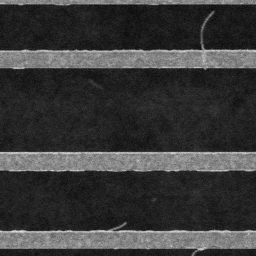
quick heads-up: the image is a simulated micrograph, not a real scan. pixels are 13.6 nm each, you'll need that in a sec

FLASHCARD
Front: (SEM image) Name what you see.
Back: lines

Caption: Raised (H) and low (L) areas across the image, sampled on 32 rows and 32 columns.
LLHLLLLHHLLLLLLLLLLHLLLLLLLLLLLL
LLLLLLLLLLLLLLLLLLLLLLLLLLLLLLLL
LLLLLLLLLLLLLLLLLLLLLLLLLLLLLLLL
LLLLLLLLLLLLLLLLLLLLLLLLLLLLLLLL
LLLLLLLLLLLLLLLLLLLLLLLLLLLLLLLL
LLLLLLLLLLLLLLLLLLLLLLLLLLLLLLLL
HHHHHHHHHHHHHHHHHHHHHHHHHHHHHHHH
HHHHHHHHHHHHHHHHHHHHHHHHHHHHHHHH
LHHLLLLLLLLLLLLLLLLLLLLLLHLLLLLL
LLLLLLLLLLLLLLLLLLLLLLLLLLLLLLLL
LLLLLLLLLLLLLLLLLLLLLLLLLLLLLLLL
LLLLLLLLLLLLLLLLLLLLLLLLLLLLLLLL
LLLLLLLLLLLLLLLLLLLLLLLLLLLLLLLL
LLLLLLLLLLLLLLLLLLLLLLLLLLLLLLLL
LLLLLLLLLLLLLLLLLLLLLLLLLLLLLLLL
LLLLLLLLLLLLLLLLLLLLLLLLLLLLLLLL
LLLLLLLLLLLLLLLLLLLLLLLLLLLLLLLL
LLLLLLLLLLLLLLLLLLLLLLLLLLLLLLLL
LLLLLLLLLLLLLLLLLLLLLLLLLLLLLLLL
HHHHHHHHHHHHHHHHHHHHHHHHHHHHHHHH
HHHHHHHHHHHHHHHHHHHHHHHHHHHHHHHH
LLLLLLLLLLLLLLLLLLLLLLLLLLLLLLLL
LLLLLLLLLLLLLLLLLLLLLLLLLLLLLLLL
LLLLLLLLLLLLLLLLLLLLLLLLLLLLLLLL
LLLLLLLLLLLLLLLLLLLLLLLLLLLLLLLL
LLLLLLLLLLLLLLLLLLLLLLLLLLLLLLLL
LLLLLLLLLLLLLLLLLLLLLLLLLLLLLLLL
LLLLLLLLLLLLLLLLLLLLLLLLLLLLLLLL
LLLLLLLLLLLLLLLLLLLLLLLLLLLLLLLL
HHHHHHHHHHHHHHHHHHHHHHHHHHHHHHHH
HHHHHHHHHHHHHHHHHHHHHHHHHHHHHHHH
LLLLLLLLLLLLLLLLLLLLLLLLLLLLLLLL